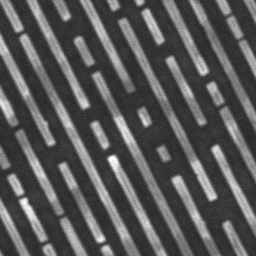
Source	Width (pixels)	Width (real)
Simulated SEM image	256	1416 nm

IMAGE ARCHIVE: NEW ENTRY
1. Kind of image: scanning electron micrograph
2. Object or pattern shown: parallel lines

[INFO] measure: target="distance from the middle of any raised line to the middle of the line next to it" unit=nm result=134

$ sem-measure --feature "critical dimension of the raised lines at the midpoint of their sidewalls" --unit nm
41.8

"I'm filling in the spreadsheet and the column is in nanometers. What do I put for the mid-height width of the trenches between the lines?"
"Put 88.6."